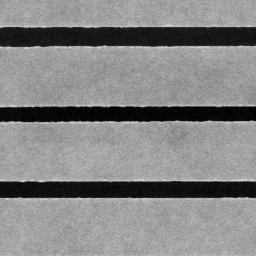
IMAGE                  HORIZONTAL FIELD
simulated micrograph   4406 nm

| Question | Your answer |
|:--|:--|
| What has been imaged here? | lines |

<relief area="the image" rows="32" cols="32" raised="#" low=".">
################################
################################
################################
................................
................................
................................
################################
################################
################################
################################
################################
################################
################################
................................
................................
################################
################################
################################
################################
################################
################################
################################
################################
................................
................................
################################
################################
################################
################################
################################
################################
################################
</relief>